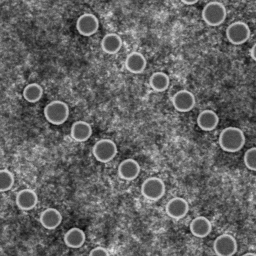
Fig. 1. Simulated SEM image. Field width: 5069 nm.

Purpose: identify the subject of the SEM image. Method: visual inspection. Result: a regular array of raised bodies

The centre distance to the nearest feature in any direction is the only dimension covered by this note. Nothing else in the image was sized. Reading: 606 nanometers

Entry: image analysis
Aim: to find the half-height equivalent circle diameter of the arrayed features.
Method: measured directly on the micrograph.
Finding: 383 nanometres